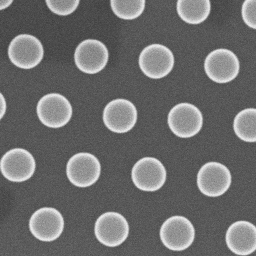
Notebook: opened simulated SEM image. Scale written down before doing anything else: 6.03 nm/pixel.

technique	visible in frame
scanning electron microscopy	an array of small figures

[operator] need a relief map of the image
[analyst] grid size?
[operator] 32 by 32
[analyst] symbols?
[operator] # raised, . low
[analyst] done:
#.....####....####....####....##
.......##.....####....####....##
.......................###....##
................................
..##............................
.####.....###...................
.####....####.....###......##...
.####....####....#####....####..
...#......###.....####....####..
..................##......###...
................................
................................
#....###......##................
#....####....####.....###.......
.....####....####....####.....##
......##.....####....####....###
..............##......###....###
..............................##
................................
####.....###....................
####....####.....###......##....
####....####.....####....####...
.##......###.....####....####...
.................###.....###....
..........................#.....
................................
....###.........................
....####....####.....##.........
....####....####....####.....###
....###.....####....####....####
.............##.....####....####
.............................##.